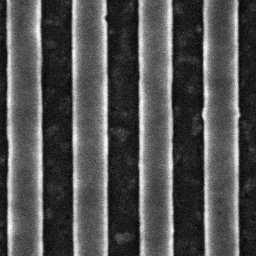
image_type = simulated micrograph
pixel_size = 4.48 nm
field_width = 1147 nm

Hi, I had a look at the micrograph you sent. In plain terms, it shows one or a few lines or trenches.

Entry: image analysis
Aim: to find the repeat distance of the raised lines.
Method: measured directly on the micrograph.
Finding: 293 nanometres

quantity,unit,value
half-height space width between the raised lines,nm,147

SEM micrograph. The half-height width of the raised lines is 147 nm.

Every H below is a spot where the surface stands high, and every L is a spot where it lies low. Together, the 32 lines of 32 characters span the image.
LHHHHLLLLHHHHLLLLHHHHLLLLLHHHHLL
LHHHHLLLLHHHHLLLLHHHHLLLLLHHHHLL
LHHHHLLLLHHHHLLLLHHHHLLLLLHHHHLL
LHHHHLLLLHHHHLLLLHHHHLLLLLHHHHLL
LHHHHLLLLHHHHLLLLHHHHLLLLLHHHHLL
LHHHHLLLLHHHHLLLLHHHHLLLLLHHHHLL
LHHHHLLLLHHHHLLLLHHHHLLLLLHHHHLL
LHHHHLLLLHHHHLLLLHHHHLLLLLHHHHLL
LHHHHLLLLHHHHLLLLLHHHLLLLLHHHHLL
LHHHHLLLLHHHHLLLLLHHHLLLLLHHHHLL
LHHHHLLLLHHHHLLLLHHHHLLLLLHHHHLL
LHHHHLLLLHHHHLLLLHHHHLLLLLHHHHLL
LHHHHLLLLHHHHLLLLLHHHLLLLLHHHHLL
LHHHHLLLLHHHHLLLLLHHHLLLLLHHHHLL
LHHHHLLLLHHHHLLLLLHHHLLLLHHHHHLL
LHHHHLLLLHHHHLLLLLHHHLLLLLHHHHLL
LHHHHLLLLHHHHLLLLLHHHLLLLLHHHHLL
LHHHHLLLLHHHHLLLLLHHHLLLLLHHHHLL
LHHHHLLLLHHHHLLLLLHHHLLLLLHHHHLL
LHHHHLLLLHHHHLLLLLHHHLLLLLHHHHLL
LHHHHLLLLHHHHLLLLLHHHLLLLLHHHHLL
LHHHHLLLLHHHHLLLLLHHHLLLLLHHHHLL
LHHHHLLLLHHHHLLLLLHHHLLLLLHHHHLL
LHHHHLLLLHHHHLLLLLHHHLLLLLHHHHLL
LHHHHLLLLHHHHLLLLLHHHLLLLLHHHHLL
LHHHHLLLLHHHHLLLLLHHHLLLLLHHHHLL
LHHHHLLLLHHHHLLLLLHHHHLLLLHHHHLL
LHHHHLLLLHHHHLLLLLHHHHLLLLHHHHLL
LHHHHLLLLHHHHLLLLLHHHHLLLLHHHHLL
LHHHHLLLLHHHHLLLLLHHHHLLLLHHHHLL
LHHHHLLLLHHHHLLLLLHHHLLLLLHHHHLL
LHHHHLLLLHHHHLLLLLHHHLLLLLHHHHLL